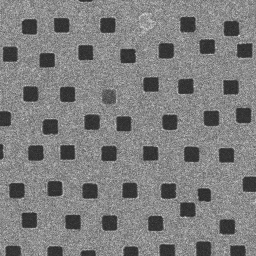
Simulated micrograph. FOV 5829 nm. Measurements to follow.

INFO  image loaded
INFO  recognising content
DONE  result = a regular array of holes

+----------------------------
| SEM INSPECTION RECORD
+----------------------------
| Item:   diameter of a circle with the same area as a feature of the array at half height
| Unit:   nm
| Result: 392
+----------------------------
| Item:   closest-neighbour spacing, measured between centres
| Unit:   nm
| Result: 768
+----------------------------